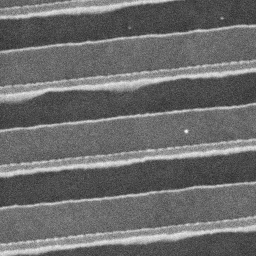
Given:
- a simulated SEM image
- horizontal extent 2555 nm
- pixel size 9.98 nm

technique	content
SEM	lines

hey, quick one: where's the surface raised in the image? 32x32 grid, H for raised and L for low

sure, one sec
HHHHHHHHHHHHHHHHLLLLLLLLLLLLLLLL
HHHHHHHLLLLLLLLLLLLLLLLLLLLLLLLL
LLLLLLLLLLLLLLLLLLLLLLLLLLLLLLLL
LLLLLLLLLLLLLLLLLLLLLLLLLLLLHHHH
LLLLLLLLLLLLLLLLLLHHHHHHHHHHHHHH
LLLLLLLLLLHHHHHHHHHHHHHHHHHHHHHH
HHHHHHHHHHHHHHHHHHHHHHHHHHHHHHHH
HHHHHHHHHHHHHHHHHHHHHHHHHHHHHHHH
HHHHHHHHHHHHHHHHHHHHHHHHHHHHHHHH
HHHHHHHHHHHHHHHHHHHHHHHLLLLLLLLL
HHHHHHHHHHHHHHHHLLLLLLLLLLLLLLLL
HHHHLLLLLLLLLLLLLLLLLLLLLLLLLLLL
LLLLLLLLLLLLLLLLLLLLLLLLLLLLLLLL
LLLLLLLLLLLLLLLLLLLLLLLLLLLLHHHH
LLLLLLLLLLLLLLLLHHHHHHHHHHHHHHHH
LLLLLLLLHHHHHHHHHHHHHHHHHHHHHHHH
HHHHHHHHHHHHHHHHHHHHHHHHHHHHHHHH
HHHHHHHHHHHHHHHHHHHHHHHHHHHHHHHH
HHHHHHHHHHHHHHHHHHHHHHHHHHHHHHHL
HHHHHHHHHHHHHHHHHHHHHHLLLLLLLLLL
HHHHHHHHHHHHHLLLLLLLLLLLLLLLLLLL
HHLLLLLLLLLLLLLLLLLLLLLLLLLLLLLL
LLLLLLLLLLLLLLLLLLLLLLLLLLLLLLLL
LLLLLLLLLLLLLLLLLLLLLLLLHHHHHHHH
LLLLLLLLLLLLLLLHHHHHHHHHHHHHHHHH
LLLLLLHHHHHHHHHHHHHHHHHHHHHHHHHH
HHHHHHHHHHHHHHHHHHHHHHHHHHHHHHHH
HHHHHHHHHHHHHHHHHHHHHHHHHHHHHHHH
HHHHHHHHHHHHHHHHHHHHHHHHHHHHHHHL
HHHHHHHHHHHHHHHHHHHHLLLLLLLLLLLL
HHHHHHHHHHHLLLLLLLLLLLLLLLLLLLLL
HLLLLLLLLLLLLLLLLLLLLLLLLLLLLLLL